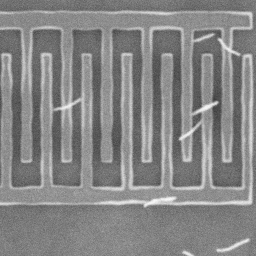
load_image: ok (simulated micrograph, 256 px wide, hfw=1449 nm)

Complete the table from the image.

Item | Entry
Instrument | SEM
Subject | groups of lines, slits or small figures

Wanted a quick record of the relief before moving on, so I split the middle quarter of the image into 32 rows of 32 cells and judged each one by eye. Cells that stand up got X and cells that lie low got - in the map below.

XX---XX---XX---XX---XX--XXX---XX
XX---XX---XX---XX---XX--XXX---XX
XX---XX---XX---XX---XX--XXX---XX
XX---XX---XX---XX---XX--XXX---XX
XX---XX--XXX---XX---XX--XXX---XX
XX---XX--XXX---XX---XX--XXX---XX
XX---XX--XXX---XX---XX--XXX---XX
XX---XX--XXX---XX---XX--XXX---XX
XX---XX--XXX---XX---XX---XX---XX
XX---XX--XXX---XX---XX---XX---XX
XX---XX---XX---XX---XX---XX---XX
X----XX--XXX---XX---XX---XX---XX
X----XX--XXX---XX---XX---XX---XX
XX---XX--XXX---XX---XX---XX---XX
XX---XX--XXX---XX---XX---XX---XX
XX---XX--XXX---XX---XX---XX---XX
XX---XX---XX---XX---XX---XX---XX
XX---XX---XX---XX---XX---XX---XX
XX---XX---XX---XX---XX---XX--XXX
XX---XX--XXX---XX---X----XX---XX
XX---XX--XXX--XXX---X----XX---XX
XX---XX--XXX--XXX---X----XX---XX
XX---XX--XXX---XX---XX---XX---XX
XX---XX--XXX---XX---XX---XX---X-
-----XX--------XX--------XX-----
-----XX--------XX--------XX-----
----XXX--------XX--------XX-----
----XXX--------XX--------XX-----
----XXX--------XX--------XX-----
----XXX--------XX--------XX-----
----XXX--------XX-------XXX-----
XXXXXXXXXXXXXXXXXXXXXXXXXXXXXXXX